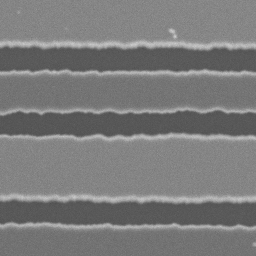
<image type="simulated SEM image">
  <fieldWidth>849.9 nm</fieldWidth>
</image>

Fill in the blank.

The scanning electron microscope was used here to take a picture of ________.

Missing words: lines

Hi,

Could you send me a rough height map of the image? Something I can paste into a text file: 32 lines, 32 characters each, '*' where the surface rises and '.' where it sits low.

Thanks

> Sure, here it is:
********************************
********************************
********************************
********************************
********************************
********************************
................................
................................
................................
********************************
********************************
********************************
********************************
********************************
................................
................................
................................
********************************
********************************
********************************
********************************
********************************
********************************
********************************
********************************
................................
................................
................................
********************************
********************************
********************************
********************************